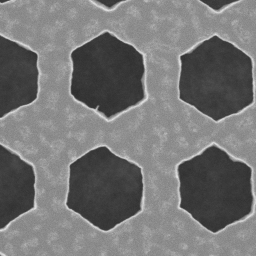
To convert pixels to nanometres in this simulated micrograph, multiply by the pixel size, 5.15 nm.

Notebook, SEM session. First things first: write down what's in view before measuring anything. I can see holes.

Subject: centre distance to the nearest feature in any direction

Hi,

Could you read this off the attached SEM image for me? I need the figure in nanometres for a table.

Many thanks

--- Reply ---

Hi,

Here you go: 564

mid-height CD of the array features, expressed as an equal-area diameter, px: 77.9